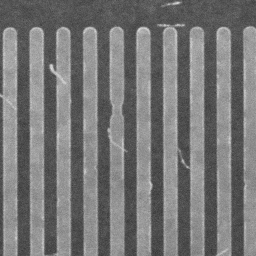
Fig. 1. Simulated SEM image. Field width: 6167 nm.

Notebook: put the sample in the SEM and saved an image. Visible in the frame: parallel lines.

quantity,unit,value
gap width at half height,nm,334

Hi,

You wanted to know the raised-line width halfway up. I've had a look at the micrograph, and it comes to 310 nm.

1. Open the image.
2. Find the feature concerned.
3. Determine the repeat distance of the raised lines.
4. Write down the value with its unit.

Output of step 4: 643 nm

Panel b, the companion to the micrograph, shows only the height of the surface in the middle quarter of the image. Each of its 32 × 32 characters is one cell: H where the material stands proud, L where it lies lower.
HLLLLHHHLLLLHHHLLLHHHLLLLHHHLLLL
HLLLLHHHLLLLHHHLLLHHHLLLLHHHLLLL
HLLLLHHHLLLLHHHLLLHHHLLLLHHHLLLL
HLLLLHHHLLLLHHHLLLHHHLLLLHHHLLLL
HLLLLHHHLLLLHHHLLLHHHLLLLHHHLLLL
HHLLLHHHLLLLHHHLLLHHHLLLLHHHLLLL
HHLLLHHHLLLLHHHLLLHHHLLLLHHHLLLL
HLLLLHHHLLLLHHHLLLHHHLLLLHHHLLLL
HHLLLHHHLLLLHHHLLLHHHLLLLHHHLLLL
HHLLLHHHLLLLHHHLLLHHHLLLLHHHLLLL
HLLLLHHHLLLLHHLLLLHHHLLLLHHHLLLL
HLLLLHHHLLLLHHLLLLHHHLLLLHHHLLLL
HLLLLHHHLLLLHHLLLLHHHLLLLHHHLLLL
HLLLLHHHLLLLHHHLLLHHHLLLLHHHLLLL
HLLLLHHHLLLLHHHLLLHHHLLLLHHHLLLL
HLLLLHHHLLLLHHHLLLHHHLLLLHHHLLLL
HLLLLHHHLLLLHHHLLLHHHLLLLHHHLLLL
HLLLLHHHLLLLHHHLLLHHHLLLLHHHLLLL
HLLLLHHHLLLHHHHLLLHHHLLLLHHHLLLL
HLLLLHHHLLLLHHHLLLHHHLLLLHHHLLLL
HLLLLHHHLLLLHHHLLLHHHLLLLHHHLLLL
HLLLLHHHLLLLHHHLLLHHHLLLLHHHLLLL
HLLLLHHHLLLLHHHLLLHHHLLLLHHHLLLL
HLLLLHHHLLLLHHHLLLHHHLLLLHHHLLLL
HLLLLHHHLLLLHHHLLLHHHLLLLHHHLLLL
HLLLLHHHLLLLHHHLLLHHHLLLLHHHLLLL
HLLLLHHHLLLLHHHLLLHHHLLLLHHHLLLL
HLLLLHHHLLLLHHHLLLHHHLLLLHHHLLLL
HLLLLHHHLLLLHHHLLLHHHLLLLHHHLLLL
HLLLLHHHLLLLHHHLLLHHHHLLLHHHLLLL
HLLLLHHHLLLLHHHLLLHHHHLLLHHHLLLL
HLLLLHHHLLLLHHHLLLHHHHLLLHHHLLLL